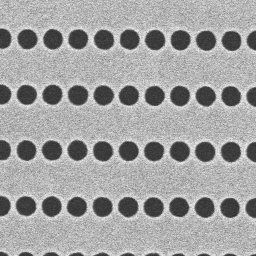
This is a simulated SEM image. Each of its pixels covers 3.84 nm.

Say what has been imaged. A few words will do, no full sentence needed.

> a regular array of holes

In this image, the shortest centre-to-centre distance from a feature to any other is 97.4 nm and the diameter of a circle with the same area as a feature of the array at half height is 76.5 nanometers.